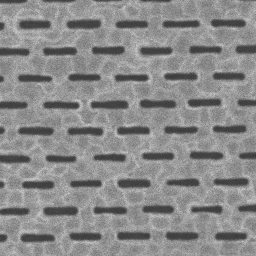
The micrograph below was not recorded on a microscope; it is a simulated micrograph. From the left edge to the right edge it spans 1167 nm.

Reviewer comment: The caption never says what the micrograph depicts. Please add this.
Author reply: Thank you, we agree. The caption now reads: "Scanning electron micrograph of a regular array of holes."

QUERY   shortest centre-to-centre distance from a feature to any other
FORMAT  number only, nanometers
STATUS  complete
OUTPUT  161